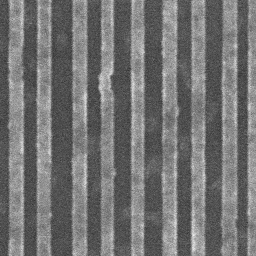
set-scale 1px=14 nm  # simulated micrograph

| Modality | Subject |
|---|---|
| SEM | parallel lines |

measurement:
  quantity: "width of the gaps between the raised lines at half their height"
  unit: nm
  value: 237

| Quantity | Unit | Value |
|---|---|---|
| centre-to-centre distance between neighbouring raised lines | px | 30.4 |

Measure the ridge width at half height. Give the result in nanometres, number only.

179